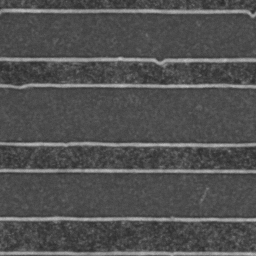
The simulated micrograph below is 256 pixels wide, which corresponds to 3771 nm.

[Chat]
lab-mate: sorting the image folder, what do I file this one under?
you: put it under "one or a few lines or trenches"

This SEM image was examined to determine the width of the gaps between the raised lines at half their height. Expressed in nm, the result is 716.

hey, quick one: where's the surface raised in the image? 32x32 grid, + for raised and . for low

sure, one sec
++++++++++++++++++++++++++++++++
...............................+
................................
................................
................................
................................
................................
+....+.....+...+................
++++++++++++++++++++++++++++++++
++++++++++++++++++++++++++++++++
++++++++++++++++++++++++++++++++
................................
................................
................................
................................
................................
................................
................................
++++++++++++++++++++++++++++++++
++++++++++++++++++++++++++++++++
++++++++++++++++++++++++++++++++
................................
................................
................................
................................
................................
................................
++++++++++++++++++++++++.+++....
++++++++++++++++++++++++++++++++
++++++++++++++++++++++++++++++++
++++++++++++++++++++++++++++++++
++++++++++++++++++++++++++++++++